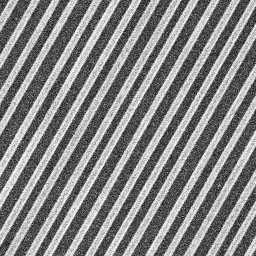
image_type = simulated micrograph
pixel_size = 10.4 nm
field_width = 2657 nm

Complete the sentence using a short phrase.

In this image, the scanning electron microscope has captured parallel lines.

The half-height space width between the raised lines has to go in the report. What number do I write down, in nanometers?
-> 120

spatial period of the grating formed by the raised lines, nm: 179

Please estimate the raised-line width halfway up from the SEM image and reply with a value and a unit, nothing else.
5.85 pixels